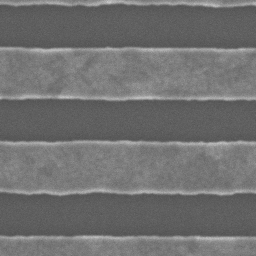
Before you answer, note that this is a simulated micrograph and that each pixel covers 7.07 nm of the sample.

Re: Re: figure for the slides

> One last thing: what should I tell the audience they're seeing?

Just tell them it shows lines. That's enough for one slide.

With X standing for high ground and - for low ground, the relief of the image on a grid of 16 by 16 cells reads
----------------
----------------
----------------
XXXXXXXXXXXXXXXX
XXXXXXXXXXXXXXXX
XXXXXXXXXXXXXXXX
----------------
----------------
----------------
XXXXXXXXXXXXXXXX
XXXXXXXXXXXXXXXX
XXXXXXXXXXXXXXXX
----------------
----------------
----------------
XXXXXXXXXXXXXXXX